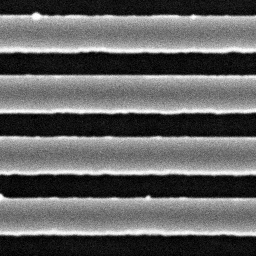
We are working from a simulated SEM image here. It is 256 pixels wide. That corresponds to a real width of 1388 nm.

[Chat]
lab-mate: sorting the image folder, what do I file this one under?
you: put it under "lines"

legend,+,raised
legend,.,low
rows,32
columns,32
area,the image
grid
................................
................................
++++++++++++++++++++++++++++++++
++++++++++++++++++++++++++++++++
++++++++++++++++++++++++++++++++
++++++++++++++++++++++++++++++++
.+..+..+++....++++.+++...+++..+.
................................
................................
...+............................
++++++++++++++++++++++++++++++++
++++++++++++++++++++++++++++++++
++++++++++++++++++++++++++++++++
++++++++++++++++++++++++++++++++
................................
................................
................................
++++++++++++++++++++++++++++++++
++++++++++++++++++++++++++++++++
++++++++++++++++++++++++++++++++
++++++++++++++++++++++++++++++++
++++++++++++++++++++++++++++++++
................................
................................
................................
++++++++++++++++++++++++++++++++
++++++++++++++++++++++++++++++++
++++++++++++++++++++++++++++++++
++++++++++++++++++++++++++++++++
................................
................................
................................